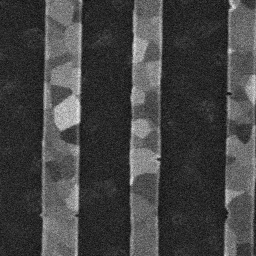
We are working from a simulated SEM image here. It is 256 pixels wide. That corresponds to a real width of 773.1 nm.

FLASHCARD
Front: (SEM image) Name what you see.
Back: one or a few lines or trenches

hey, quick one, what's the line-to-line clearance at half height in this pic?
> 186 nm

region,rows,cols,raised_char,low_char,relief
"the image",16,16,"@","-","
---@@---@@----@@
---@@---@@----@@
---@@---@@----@@
---@@---@@----@@
---@@---@@----@@
---@@---@@----@@
---@@---@@----@@
---@@---@@----@@
---@@---@@----@@
---@@---@@----@@
---@@---@@----@@
---@@---@@----@@
---@@---@@----@@
---@@---@@----@@
---@@---@@----@@
---@@---@@----@@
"